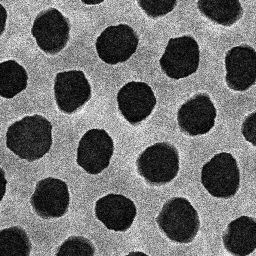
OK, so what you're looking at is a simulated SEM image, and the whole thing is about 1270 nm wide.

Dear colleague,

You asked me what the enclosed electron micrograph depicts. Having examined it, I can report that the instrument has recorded a regular array of holes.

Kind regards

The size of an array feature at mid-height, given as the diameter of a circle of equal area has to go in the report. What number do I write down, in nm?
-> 198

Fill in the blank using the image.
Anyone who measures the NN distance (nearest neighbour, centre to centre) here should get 304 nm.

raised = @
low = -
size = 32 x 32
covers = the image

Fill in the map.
@@@@@@@@@@@-@@@@@@----@@@-----@@
-@@@@@-@@@@@@@@@@@---@@@@-----@@
-@@@----@@@@@@@@@@@@@@@@@@@--@@@
-@@@-----@@@@---@@@@@@@@@@@@@@@@
@@@@----@@@@-----@@@@@@@@@@@@@@@
@@@@@---@@@@-----@@@@----@@@@@@@
@@@@@@-@@@@@-----@@@@----@@@@---
@@@@@@@@@@@@@---@@@@-----@@@----
---@@@@@@@@@@@@@@@@@-----@@@----
---@@@@----@@@@@@@@@@---@@@@----
---@@@@----@@@@@--@@@@@@@@@@@---
---@@@@----@@@@----@@@@@@@@@@@@@
@@@@@@@----@@@@----@@@@@--@@@@@@
@@@@@@@@--@@@@@----@@@@----@@@@@
@@@--@@@@@@@@@@@--@@@@-----@@@@-
@@----@@@@@@@@@@@@@@@@-----@@@--
@-----@@@@@--@@@@@@@@@@---@@@@--
@------@@@----@@@@@@@@@@@@@@@@@-
@-----@@@@----@@@@@---@@@@@@@@@@
@@---@@@@@----@@@@----@@@@@--@@@
@@@@@@@@@@----@@@-----@@@@----@@
@@@@@@@@@@@--@@@@-----@@@-----@@
-@@@@--@@@@@@@@@@@---@@@@-----@@
-@@@@---@@@@@@@@@@@@@@@@@@----@@
@@@@-----@@@@--@@@@@@@@@@@@--@@@
@@@@----@@@@-----@@@@---@@@@@@@@
@@@@@---@@@@-----@@@-----@@@@@@@
@@@@@@@@@@@@-----@@@-----@@@@--@
@-@@@@@@@@@@@---@@@@-----@@@@---
---@@@@@@@@@@@@@@@@@@---@@@@----
----@@@@---@@@@@@@@@@@@@@@@@----
----@@@-----@@@@@@@@@@@@@@@@@--@